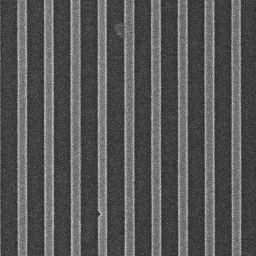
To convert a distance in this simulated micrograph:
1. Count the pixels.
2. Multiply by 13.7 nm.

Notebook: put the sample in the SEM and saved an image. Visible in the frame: parallel lines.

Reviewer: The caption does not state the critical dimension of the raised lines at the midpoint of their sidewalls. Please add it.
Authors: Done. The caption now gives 0.12 um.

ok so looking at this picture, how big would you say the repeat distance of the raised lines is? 366 nanometers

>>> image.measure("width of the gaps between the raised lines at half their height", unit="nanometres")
252